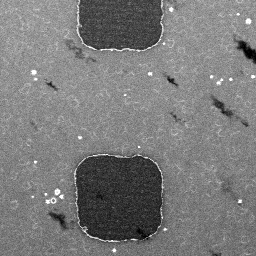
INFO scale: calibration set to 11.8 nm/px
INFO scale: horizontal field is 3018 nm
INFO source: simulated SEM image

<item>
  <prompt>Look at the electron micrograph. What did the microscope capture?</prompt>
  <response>raised bodies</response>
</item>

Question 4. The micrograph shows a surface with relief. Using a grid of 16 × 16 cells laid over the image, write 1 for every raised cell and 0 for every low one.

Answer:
0000011111000000
0000011111000000
0000011111000000
0000000000000000
0000000000000000
0000000000000000
0000000000000000
0000000000000000
0000000000000000
0000000000000000
0000011111000000
0000011111000000
0000011111000000
0000011111000000
0000011111000000
0000000000000000